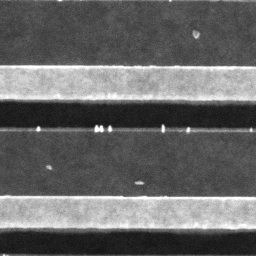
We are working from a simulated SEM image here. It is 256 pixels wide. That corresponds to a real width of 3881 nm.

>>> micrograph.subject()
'lines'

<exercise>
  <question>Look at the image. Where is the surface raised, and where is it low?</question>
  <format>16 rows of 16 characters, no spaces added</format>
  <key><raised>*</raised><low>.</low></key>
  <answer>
****************
****************
****************
****************
****************
****************
................
................
****************
****************
****************
****************
****************
****************
................
................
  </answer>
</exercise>